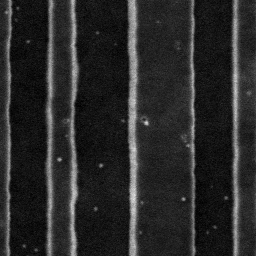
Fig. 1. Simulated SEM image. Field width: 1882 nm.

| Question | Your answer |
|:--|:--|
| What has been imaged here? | lines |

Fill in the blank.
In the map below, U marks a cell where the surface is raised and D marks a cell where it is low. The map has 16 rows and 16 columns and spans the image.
UDDUUDDDUUUUDDDU
UDDUUDDDUUUUDDDU
UDDUUDDDUUUUDDDU
UDDUUDDDUUUUDDDU
UDDUUDDDUUUUDDDU
UDDUUDDDUUUUDDDU
UDDUUDDDUUUUDDDU
UDDUUDDDUUUUDDDU
UDDUDDDDUUUUDDDU
UDDUUDDDUUUUDDDU
UDDUUDDDUUUUDDDU
UDDUUDDDUUUUDDDU
UDDUUDDDUUUUDDDU
UDDUDDDDUUUUDDDU
UDDUUDDDUUUUDDDU
UDDUUDDDUUUUDDDU